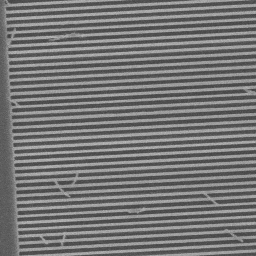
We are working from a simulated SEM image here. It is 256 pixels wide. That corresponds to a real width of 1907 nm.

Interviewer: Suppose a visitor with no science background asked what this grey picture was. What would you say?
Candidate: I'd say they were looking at parallel lines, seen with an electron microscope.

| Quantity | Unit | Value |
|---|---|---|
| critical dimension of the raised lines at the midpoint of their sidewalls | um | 0.0223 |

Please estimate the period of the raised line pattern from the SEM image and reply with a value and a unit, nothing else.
0.0507 micrometres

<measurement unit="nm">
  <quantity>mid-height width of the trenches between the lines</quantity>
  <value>29.8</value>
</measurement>